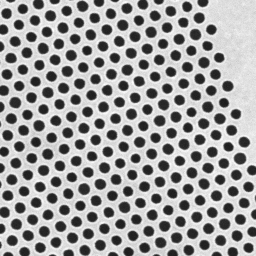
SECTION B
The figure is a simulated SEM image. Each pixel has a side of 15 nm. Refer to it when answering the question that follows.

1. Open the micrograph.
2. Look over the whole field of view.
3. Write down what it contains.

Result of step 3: a regular array of holes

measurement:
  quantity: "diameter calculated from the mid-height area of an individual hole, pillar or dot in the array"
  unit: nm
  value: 169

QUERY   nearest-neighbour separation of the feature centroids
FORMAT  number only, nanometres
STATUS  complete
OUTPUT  246